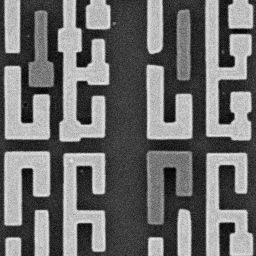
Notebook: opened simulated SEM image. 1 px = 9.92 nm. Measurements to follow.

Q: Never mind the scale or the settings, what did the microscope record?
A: wiring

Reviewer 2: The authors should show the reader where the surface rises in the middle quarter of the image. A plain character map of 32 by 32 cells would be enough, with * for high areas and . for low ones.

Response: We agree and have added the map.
***...*****.................***.
***********..........****...***.
***********..........****...***.
***********..........****...***.
***...*****..........****.......
***..................****.......
***..................****.......
***..................****.......
***....***...........****...****
***....***...........****...****
***....***...........****...****
***....***...........****...****
***....***...........****...****
***....***...........****...****
****...***...........****..*****
**********...........***********
**********...........***********
**********...........***********
****.................**********.
................................
................................
................................
.....................***********
**********...........***********
**********...........***********
***....***...........***********
***....***...........****...****
***....***...........****...****
***....***...........****...****
***....***...........****...****
***....***...........****...****
***....***...........****...****